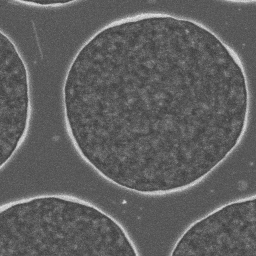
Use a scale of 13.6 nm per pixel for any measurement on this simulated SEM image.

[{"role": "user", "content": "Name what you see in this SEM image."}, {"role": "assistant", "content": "holes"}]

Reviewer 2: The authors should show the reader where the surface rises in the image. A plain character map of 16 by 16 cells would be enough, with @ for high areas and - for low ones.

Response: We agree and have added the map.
@@@@@@@@@@@@@@@@
@@@@@@@@----@@@@
-@@@@@--------@@
-@@@@----------@
--@@-----------@
--@@-----------@
--@@-----------@
--@@-----------@
-@@@@----------@
-@@@@---------@@
@@@@@@-------@@@
@@@@@@@-----@@@@
@@--@@@@@@@@@@@-
-------@@@@@@---
--------@@@@----
--------@@@-----